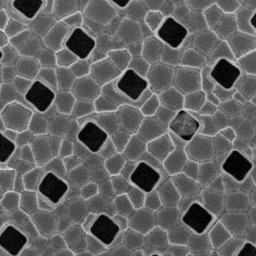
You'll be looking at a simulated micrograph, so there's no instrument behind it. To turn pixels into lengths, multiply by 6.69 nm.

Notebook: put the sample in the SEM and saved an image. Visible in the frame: a regular array of holes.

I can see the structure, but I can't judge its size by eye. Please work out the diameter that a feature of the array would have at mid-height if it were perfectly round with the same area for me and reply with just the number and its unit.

26.6 px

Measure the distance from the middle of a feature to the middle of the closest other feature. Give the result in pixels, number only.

65.7